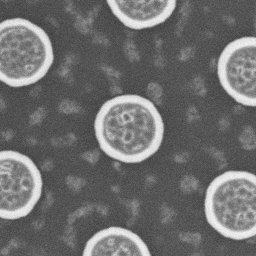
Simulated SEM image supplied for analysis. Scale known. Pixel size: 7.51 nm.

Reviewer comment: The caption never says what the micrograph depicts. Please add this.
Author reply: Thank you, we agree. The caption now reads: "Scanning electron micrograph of raised bodies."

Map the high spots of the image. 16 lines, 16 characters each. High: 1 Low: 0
0000000111100000
1100000010000000
1110000000000000
1110000000000011
1110000000000011
0000000000000011
0000000110000000
0000001111000000
0000001111000000
0000000110000000
1100000000000000
1100000000000111
1100000000000111
0000000000000111
0000000100000011
0000001110000000